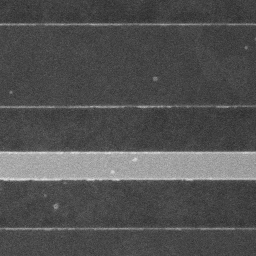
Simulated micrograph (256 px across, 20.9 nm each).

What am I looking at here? lines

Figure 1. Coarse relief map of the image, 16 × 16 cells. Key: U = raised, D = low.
DDDDDDDDDDDDDDDD
DDDDDDDDDDDDDDDD
UUUUUUUUUUUUUUUU
UUUUUUUUUUUUUUUU
UUUUUUUUUUUUUUUU
UUUUUUUUUUUUUUUU
UUUUUUUUUUUUUUUU
DDDDDDDDDDDDDDDD
DDDDDDDDDDDDDDDD
DDDDDDDDDDDDDDDD
DDDDDDDDDDDDDDDD
DDDDDDDDDDDDDDDD
DDDDDDDDDDDDDDDD
DDDDDDDDDDDDDDDD
UUUUUUUUUUUUUUUU
UUUUUUUUUUUUUUUU